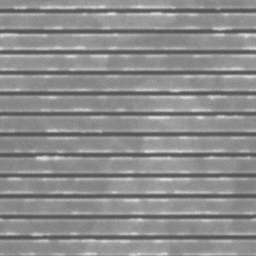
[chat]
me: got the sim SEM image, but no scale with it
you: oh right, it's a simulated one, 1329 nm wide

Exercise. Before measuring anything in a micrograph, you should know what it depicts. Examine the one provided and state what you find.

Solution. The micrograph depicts parallel lines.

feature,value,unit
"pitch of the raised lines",107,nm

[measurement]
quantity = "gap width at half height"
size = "28.6 nanometres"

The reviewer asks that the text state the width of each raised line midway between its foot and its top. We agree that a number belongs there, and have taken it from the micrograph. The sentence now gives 15.5 px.